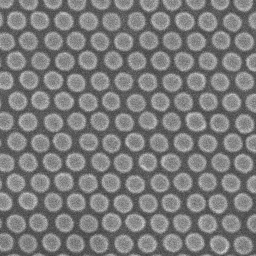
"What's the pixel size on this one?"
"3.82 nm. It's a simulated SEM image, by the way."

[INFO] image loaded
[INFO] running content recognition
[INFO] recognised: a regular array of raised bodies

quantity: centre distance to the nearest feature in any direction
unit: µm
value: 0.086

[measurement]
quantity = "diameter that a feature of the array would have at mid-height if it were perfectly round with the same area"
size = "67.2 nm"